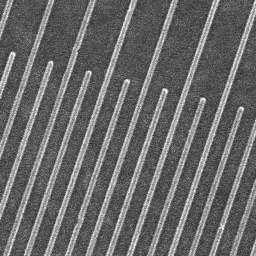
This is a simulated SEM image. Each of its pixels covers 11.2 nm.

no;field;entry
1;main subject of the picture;parallel lines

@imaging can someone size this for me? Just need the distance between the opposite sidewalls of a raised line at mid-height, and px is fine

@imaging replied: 4.49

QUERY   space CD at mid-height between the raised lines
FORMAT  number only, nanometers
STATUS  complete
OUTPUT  172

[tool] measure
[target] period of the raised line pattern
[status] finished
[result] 217 nm